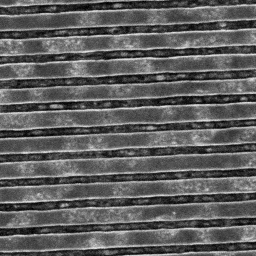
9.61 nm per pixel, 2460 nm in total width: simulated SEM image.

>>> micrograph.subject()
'parallel lines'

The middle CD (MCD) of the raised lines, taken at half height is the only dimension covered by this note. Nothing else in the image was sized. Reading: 154 nanometers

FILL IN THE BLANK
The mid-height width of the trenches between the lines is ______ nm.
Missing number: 81.6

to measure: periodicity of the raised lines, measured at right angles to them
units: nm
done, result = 235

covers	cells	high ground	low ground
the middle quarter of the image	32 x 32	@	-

@@@@@@@@@@@@@@@@@@@@@@@@@@@@@@@@
@@@@@@@@@@@@@@@@@@@@@@@@@@@@@@@@
@@@@@@@@@@@@@@@@@---------------
-----------------------@@-------
-----------------------------@@@
-------@@@@@@@@@@@@@@@@@@@@@@@@@
@@@@@@@@@@@@@@@@@@@@@@@@@@@@@@@@
@@@@@@@@@@@@@@@@@@@@@@@@@@@@@@@@
@@@@@@@@@@@@@@@@@@@@------------
--------------------------------
---------------------------@@@@@
----------@@@@@@@@@@@@@@@@@@@@@@
@@@@@@@@@@@@@@@@@@@@@@@@@@@@@@@@
@@@@@@@@@@@@@@@@@@@@@@@@@@@@@@@@
@@@@@@@@@@@@@@@@@@@@@@@@@@@@----
@@@@@@@-------------------------
--------------------------------
-------------@@@@@@@@@@@@@@@@@@@
@@@@@@@@@@@@@@@@@@@@@@@@@@@@@@@@
@@@@@@@@@@@@@@@@@@@@@@@@@@@@@@@@
@@@@@@@@@@@@@@@@@@@@@@@@@-------
@@@@@@@@------------------------
--------------------------------
---------------@@@@@@@@@@@@@@@@@
@@@@@@@@@@@@@@@@@@@@@@@@@@@@@@@@
@@@@@@@@@@@@@@@@@@@@@@@@@@@@@@@@
-@@@@@@@@@@@@@@@@@@@@@@@@@@@@@--
@@@@@@@@@@@---------------------
--------------------------------
------------------@@@@@@@@@@@@@@
@@@@@@@@@@@@@@@@@@@@@@@@@@@@@@@@
@@@@@@@@@@@@@@@@@@@@@@@@@@@@@@@@